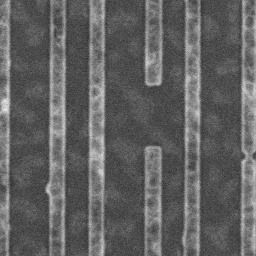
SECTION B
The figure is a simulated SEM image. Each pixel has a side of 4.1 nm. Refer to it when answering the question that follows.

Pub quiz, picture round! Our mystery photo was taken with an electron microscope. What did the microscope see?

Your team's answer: parallel lines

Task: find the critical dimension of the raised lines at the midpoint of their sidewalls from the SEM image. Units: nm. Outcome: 56.4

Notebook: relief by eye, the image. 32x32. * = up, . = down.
*.....**...**.....**...**.....**
*.....**...**.....**...**.....**
*.....**...**.....**...**.....**
*.....**...**.....**...**.....**
*......*...**.....**...**.....**
*.....**...**.....**...**.....**
*.....**...**.....**...**.....**
*.....**...**.....**...**.....**
*.....**...**.....**...**.....**
*.....**...**.....**...**.....**
*.....**...**......*...**.....**
*.....**...**..........**.....**
*.....**...**..........**.....**
*.....**...**..........**.....**
*.....**...**..........**.....**
*.....**...**..........**.....**
*.....**...**..........**.....**
*.....**...**..........**.....**
*.....**...**.....**...**.....**
*.....**...**.....**...**......*
*.....**...**.....**...**.....**
*.....**...**.....**...**.....**
*.....**...**.....**...**.....**
*.....**...**.....**...**.....**
*.....**...**.....**...**.....**
*.....**...**.....**...**.....**
*.....**...**.....**...**.....**
*.....**...**.....**...**.....**
*.....**...**.....**...**.....**
*.....**...**.....**...**.....**
*.....**...**.....**...**.....**
*.....**...**.....**...**.....**